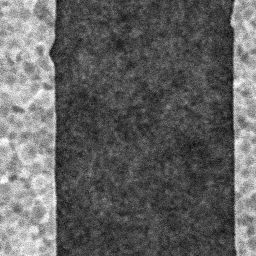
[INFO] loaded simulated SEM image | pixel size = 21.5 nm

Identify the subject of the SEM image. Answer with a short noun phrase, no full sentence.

one or a few lines or trenches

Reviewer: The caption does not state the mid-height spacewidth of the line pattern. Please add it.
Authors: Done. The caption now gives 3870 nm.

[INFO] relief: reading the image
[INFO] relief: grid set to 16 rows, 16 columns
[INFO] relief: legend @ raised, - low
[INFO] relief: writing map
@@@------------@
@@@------------@
@@@------------@
@@@------------@
@@@------------@
@@@------------@
@@@------------@
@@@------------@
@@@------------@
@@@------------@
@@@------------@
@@@------------@
@@@------------@
@@@------------@
@@@------------@
@@@------------@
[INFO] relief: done